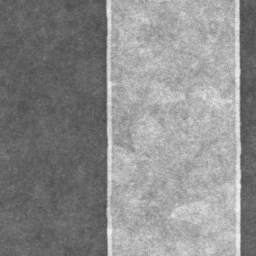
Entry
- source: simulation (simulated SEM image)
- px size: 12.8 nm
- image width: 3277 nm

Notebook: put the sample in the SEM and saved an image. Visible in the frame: one or a few lines or trenches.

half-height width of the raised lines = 1660 nm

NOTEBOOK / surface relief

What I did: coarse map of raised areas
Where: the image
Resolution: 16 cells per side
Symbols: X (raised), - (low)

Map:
-------XXXXXXXX-
-------XXXXXXXX-
-------XXXXXXXX-
-------XXXXXXXX-
-------XXXXXXXX-
-------XXXXXXXX-
-------XXXXXXXX-
-------XXXXXXXX-
-------XXXXXXXX-
-------XXXXXXXX-
-------XXXXXXXX-
-------XXXXXXXX-
-------XXXXXXXX-
-------XXXXXXXX-
-------XXXXXXXX-
-------XXXXXXXX-